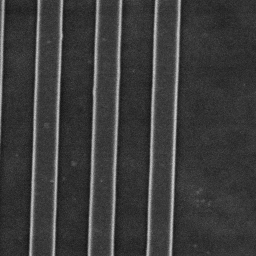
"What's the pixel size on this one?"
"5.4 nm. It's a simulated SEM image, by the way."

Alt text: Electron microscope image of parallel lines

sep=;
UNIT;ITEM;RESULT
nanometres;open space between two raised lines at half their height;191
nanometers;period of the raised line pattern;317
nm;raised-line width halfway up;129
